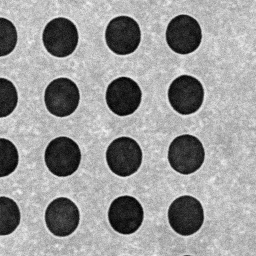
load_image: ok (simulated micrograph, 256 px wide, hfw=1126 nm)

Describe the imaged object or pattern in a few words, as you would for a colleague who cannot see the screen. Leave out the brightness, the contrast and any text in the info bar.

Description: a regular array of holes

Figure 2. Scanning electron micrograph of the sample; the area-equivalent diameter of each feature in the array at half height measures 170 nm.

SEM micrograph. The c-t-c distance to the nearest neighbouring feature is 263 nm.